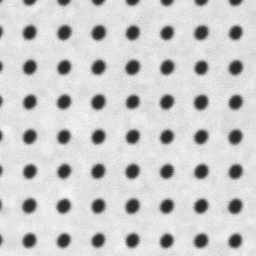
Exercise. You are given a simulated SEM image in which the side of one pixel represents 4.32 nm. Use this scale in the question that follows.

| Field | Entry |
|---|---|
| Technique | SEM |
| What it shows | a regular array of holes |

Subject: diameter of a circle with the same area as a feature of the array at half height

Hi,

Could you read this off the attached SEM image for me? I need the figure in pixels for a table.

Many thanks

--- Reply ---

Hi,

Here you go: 14.7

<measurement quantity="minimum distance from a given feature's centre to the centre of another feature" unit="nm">148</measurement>